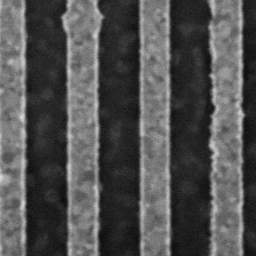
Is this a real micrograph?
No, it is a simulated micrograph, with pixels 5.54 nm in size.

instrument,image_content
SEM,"one or a few lines or trenches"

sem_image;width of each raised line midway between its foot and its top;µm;0.149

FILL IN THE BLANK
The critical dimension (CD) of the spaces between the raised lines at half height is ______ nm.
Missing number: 253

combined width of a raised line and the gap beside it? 399 nanometers